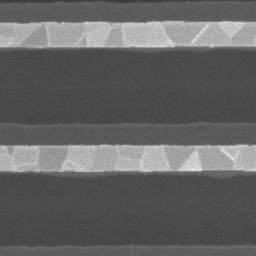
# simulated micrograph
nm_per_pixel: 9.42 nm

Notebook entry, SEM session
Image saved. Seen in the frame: lines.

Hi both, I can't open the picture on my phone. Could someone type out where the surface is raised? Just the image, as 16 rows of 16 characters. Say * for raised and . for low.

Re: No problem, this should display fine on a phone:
****************
****************
****************
................
................
................
................
................
****************
****************
****************
................
................
................
................
****************